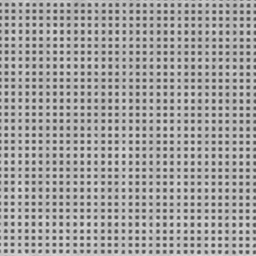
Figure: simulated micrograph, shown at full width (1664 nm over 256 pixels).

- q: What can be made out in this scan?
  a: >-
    a regular array of holes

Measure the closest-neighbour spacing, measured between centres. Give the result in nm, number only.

42.2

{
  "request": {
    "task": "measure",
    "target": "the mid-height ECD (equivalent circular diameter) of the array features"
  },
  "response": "27.4 nanometers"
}